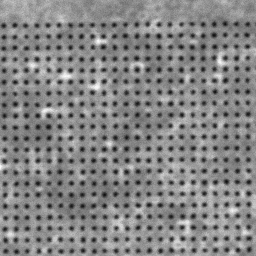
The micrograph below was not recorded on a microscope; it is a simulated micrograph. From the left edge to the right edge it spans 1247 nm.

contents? a regular array of holes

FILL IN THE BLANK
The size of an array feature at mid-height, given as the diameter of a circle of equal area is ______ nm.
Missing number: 25.8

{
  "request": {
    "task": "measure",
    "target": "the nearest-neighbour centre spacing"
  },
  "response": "52 nm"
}